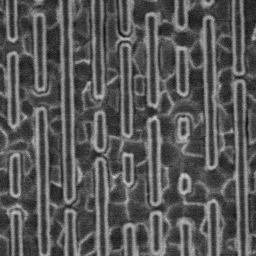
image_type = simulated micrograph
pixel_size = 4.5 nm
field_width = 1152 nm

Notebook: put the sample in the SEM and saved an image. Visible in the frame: parallel lines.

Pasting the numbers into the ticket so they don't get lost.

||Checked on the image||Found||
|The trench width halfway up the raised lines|83.8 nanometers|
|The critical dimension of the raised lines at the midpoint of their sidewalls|9.38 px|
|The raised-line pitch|127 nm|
